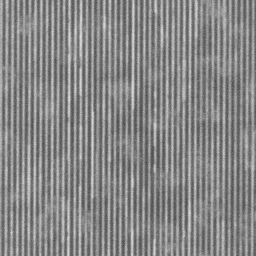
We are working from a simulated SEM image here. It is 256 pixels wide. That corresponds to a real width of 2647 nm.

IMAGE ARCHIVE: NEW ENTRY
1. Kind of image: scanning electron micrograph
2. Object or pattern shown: parallel lines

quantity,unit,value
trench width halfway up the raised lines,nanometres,46.5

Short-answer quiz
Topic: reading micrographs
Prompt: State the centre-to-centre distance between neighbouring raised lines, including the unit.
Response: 59.2 nanometres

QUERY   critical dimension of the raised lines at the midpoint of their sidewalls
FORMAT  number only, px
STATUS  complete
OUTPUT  1.25